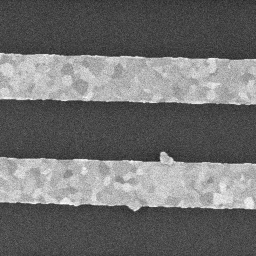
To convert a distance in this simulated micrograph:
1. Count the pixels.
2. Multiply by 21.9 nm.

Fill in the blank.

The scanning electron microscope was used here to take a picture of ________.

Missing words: lines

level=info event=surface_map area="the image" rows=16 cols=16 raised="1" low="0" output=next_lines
0000000000000000
0000000000000000
0000000000000000
1111000000000000
1111111111111111
1111111111111111
0000000000000000
0000000000000000
0000000000000000
0000000000000000
1111111111111111
1111111111111111
1111111111111111
0000000000000000
0000000000000000
0000000000000000